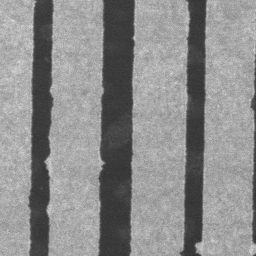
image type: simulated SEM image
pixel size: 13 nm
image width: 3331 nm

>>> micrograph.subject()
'one or a few lines or trenches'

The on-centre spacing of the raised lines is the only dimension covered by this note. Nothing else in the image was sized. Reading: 1020 nanometres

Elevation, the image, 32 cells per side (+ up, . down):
++++...++++++....++++++...++++++
++++...++++++....+++++++..++++++
++++...++++++....+++++++..++++++
++++...++++++....+++++++..++++++
++++...++++++....++++++...++++++
++++...++++++....++++++...++++++
++++...++++++....++++++...++++++
++++...++++++....++++++...++++++
++++...++++++....++++++...++++++
++++...++++++....++++++...++++++
++++...++++++....++++++...++++++
++++..+++++++....++++++...++++++
++++...++++++....+++++++..+++++.
++++...++++++....++++++...+++++.
++++...++++++....++++++...++++++
++++..++++++.....++++++...++++++
++++..+++++++....++++++...++++++
++++..++++++.....++++++...++++++
++++..++++++.....++++++...++++++
++++..++++++.....++++++...++++++
++++..+++++++....++++++...++++++
++++..++++++.....++++++...++++++
++++..++++++.....++++++...+++++.
++++..++++++.....++++++..++++++.
++++..++++++.....++++++..++++++.
++++..++++++.....++++++..++++++.
++++..++++++....+++++++..+++++++
++++..++++++....+++++++..++++++.
++++..++++++....+++++++..++++++.
++++..++++++....+++++++..++++++.
++++..++++++....+++++++..+++++++
++++..++++++....+++++++..+++++++